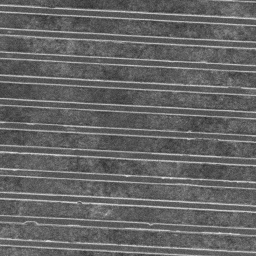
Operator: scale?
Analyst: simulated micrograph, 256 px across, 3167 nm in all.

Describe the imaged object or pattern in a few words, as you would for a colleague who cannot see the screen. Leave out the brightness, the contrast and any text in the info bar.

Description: parallel lines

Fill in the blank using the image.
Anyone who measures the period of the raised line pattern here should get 0.288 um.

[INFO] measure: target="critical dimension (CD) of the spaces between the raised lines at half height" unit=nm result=205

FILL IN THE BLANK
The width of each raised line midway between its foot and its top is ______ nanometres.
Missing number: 86.4